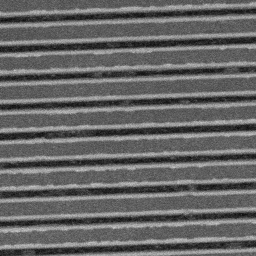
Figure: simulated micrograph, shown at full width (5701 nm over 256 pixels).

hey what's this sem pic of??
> parallel lines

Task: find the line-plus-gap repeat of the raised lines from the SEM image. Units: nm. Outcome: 649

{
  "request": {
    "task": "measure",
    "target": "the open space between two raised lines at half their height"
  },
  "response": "264 nanometres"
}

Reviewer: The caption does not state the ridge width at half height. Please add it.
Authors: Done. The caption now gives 0.378 um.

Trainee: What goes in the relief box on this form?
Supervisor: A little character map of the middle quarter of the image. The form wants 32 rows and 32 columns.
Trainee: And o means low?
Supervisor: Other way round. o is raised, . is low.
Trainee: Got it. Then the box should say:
ooooooooooooooooooooooooooo.....
................................
................................
................................
.....ooooooooooooooooooooooooooo
oooooooooooooooooooooooooooooooo
oooooooooooooooooooooooooooooooo
oooooooooooooooooooooooooooooooo
ooooooooooo.....................
................................
................................
..........oooooooooooooooooooooo
oooooooooooooooooooooooooooooooo
oooooooooooooooooooooooooooooooo
oooooooooooooooooooooooooooooooo
oooooooooooooooo................
................................
................................
...............ooooooooooooooooo
oooooooooooooooooooooooooooooooo
oooooooooooooooooooooooooooooooo
oooooooooooooooooooooooooooooooo
ooooooooooooooooooooo...........
................................
................................
..........................oooooo
oooooooooooooooooooooooooooooooo
oooooooooooooooooooooooooooooooo
oooooooooooooooooooooooooooooooo
oooooooooooooooooooooooooooooooo
ooooo...........................
................................